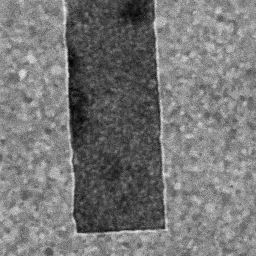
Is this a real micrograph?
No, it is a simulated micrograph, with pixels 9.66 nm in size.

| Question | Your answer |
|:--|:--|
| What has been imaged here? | one or a few lines or trenches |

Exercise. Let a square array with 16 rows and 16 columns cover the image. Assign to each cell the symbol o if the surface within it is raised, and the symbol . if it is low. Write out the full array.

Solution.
oooo......oooooo
oooo......oooooo
oooo......oooooo
oooo......oooooo
oooo......oooooo
oooo......oooooo
oooo......oooooo
oooo......oooooo
oooo......oooooo
oooo......oooooo
ooooo.....oooooo
ooooo.....oooooo
ooooo.....oooooo
ooooo.....oooooo
ooooo...oooooooo
oooooooooooooooo